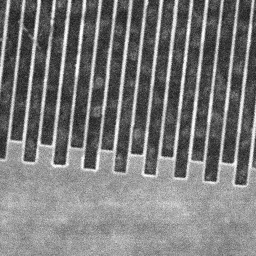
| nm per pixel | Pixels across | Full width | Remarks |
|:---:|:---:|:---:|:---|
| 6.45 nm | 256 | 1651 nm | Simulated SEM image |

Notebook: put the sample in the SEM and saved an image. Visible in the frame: parallel lines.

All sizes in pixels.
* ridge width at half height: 2.85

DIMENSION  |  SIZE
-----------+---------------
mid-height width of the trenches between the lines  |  79.3 nm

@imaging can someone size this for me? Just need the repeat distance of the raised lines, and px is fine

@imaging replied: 15.2